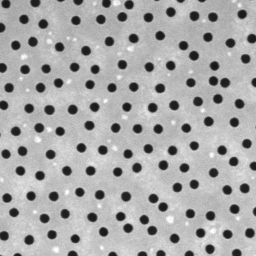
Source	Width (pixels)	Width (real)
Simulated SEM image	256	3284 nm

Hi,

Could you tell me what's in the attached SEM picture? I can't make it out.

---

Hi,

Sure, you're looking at a regular array of holes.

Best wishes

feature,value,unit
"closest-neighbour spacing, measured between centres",258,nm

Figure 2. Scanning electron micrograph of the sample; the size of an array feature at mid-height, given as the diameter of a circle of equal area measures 121 nanometers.